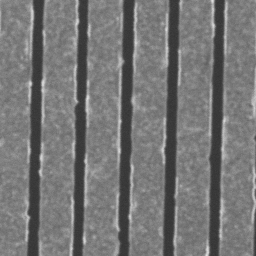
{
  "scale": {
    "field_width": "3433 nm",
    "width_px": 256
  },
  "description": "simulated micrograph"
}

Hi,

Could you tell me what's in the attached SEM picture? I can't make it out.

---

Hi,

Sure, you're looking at parallel lines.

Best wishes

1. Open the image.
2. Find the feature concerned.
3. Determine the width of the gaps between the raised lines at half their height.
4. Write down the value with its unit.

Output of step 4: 156 nm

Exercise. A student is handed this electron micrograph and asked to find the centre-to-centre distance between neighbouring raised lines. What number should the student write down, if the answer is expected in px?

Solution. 45.2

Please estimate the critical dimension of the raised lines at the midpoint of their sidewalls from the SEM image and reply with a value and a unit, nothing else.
454 nanometres